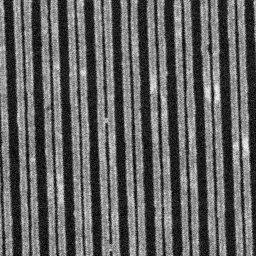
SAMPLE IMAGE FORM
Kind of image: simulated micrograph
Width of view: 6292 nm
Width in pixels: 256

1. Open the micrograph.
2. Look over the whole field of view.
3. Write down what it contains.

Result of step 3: parallel lines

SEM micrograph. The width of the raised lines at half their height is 147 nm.